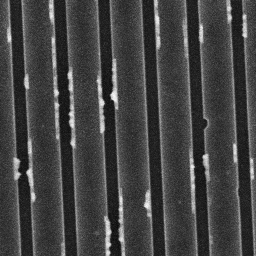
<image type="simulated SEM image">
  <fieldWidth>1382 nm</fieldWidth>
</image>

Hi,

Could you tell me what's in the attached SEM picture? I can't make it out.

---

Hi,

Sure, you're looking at parallel lines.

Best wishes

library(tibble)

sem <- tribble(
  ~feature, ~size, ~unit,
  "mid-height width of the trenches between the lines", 66.8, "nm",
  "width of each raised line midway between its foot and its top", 171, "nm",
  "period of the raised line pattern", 238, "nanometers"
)